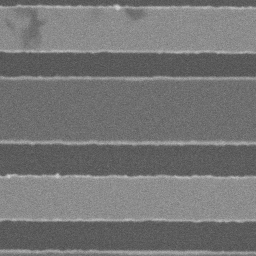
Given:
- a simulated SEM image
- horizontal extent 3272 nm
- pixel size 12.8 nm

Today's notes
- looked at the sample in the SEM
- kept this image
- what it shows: lines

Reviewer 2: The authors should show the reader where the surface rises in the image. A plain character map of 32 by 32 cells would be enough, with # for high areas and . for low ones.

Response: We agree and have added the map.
................................
################################
################################
################################
################################
################################
...........#.......#.####..#####
................................
................................
................................
################################
################################
################################
################################
################################
################################
################################
################################
................................
................................
................................
................................
################################
################################
################################
################################
################################
##################.#############
................................
................................
................................
################.#.###....#.....